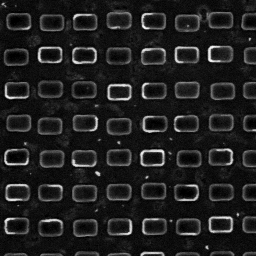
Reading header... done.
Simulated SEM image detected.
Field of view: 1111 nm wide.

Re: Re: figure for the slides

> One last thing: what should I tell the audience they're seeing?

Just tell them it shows a regular array of raised bodies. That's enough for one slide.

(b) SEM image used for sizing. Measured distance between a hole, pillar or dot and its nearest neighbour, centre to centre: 33 pixels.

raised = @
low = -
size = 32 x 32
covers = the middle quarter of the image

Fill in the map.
--------------------------------
--------------------------------
--------------------------------
---@@---------------------------
---@@@@-------------------------
--@@@@@@---@@@@@@---@@@@@---@@@@
--@@@@@@---@@@@@@---@@@@@---@@@@
--@@@@@@---@@@@@@---@@@@@---@@@@
-----------@@@@@@---@@@@@-------
--------------------------------
@@@---------@-------------------
--------------------------------
--------------------------------
--@@@@@@------------@@@@@---@@@@
--@@@@@@---@@@@@@---@@@@@@--@@@@
--@@@@@@---@@@@@@---@@@@@@--@@@@
---@@@@@---@@@@@@---@@@@@---@@@@
------------@@@-----------------
--------------------------------
--------------------------------
--------------------------------
---------------@----------------
--@@@@@@---@@@@@@--@@@@@@---@@@@
--@@@@@@---@@@@@@--@@@@@@---@@@@
--@@@@@@---@@@@@@--@@@@@@---@@@@
---@@@@@---------------------@@@
---@----------------------------
--------@-----------------------
--------------------------------
--------------------------------
---@@@@@---@@@@@----@@@@@---@@@@
--@@@@@@---@@@@@@---@@@@@---@@@@